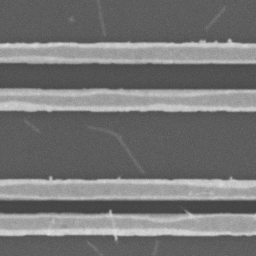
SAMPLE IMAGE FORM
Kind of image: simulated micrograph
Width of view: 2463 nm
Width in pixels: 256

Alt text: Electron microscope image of lines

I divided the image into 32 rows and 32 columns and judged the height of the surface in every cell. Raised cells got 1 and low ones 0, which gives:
00000000000000000000000000000000
00000000000000000000000000000000
00000000000000000000000000000000
00000000000000000000000000000000
00000000000000000000000000000000
00000000000000000000000000000000
11111111111111111111111111111111
11111111111111111111111111111111
00000000000000000000000000000000
00000000000000000000000000000000
00000000000000000000000000000000
11111111111111111111111111111111
11111111111111111111111111111111
00011111111111111111111111111111
00000000000000000000000000000000
00000000000000000000000000000000
00000000000000000000000000000000
00000000000000000000000000000000
00000000000000000000000000000000
00000000000000000000000000000000
00000000000000000000000000000000
00000000000000000000000000000000
00000000000000000000000000000000
11111111111111111111111111111111
11111111111111111111111111111111
00000000000000000000000000000000
00000000000000000000000000000000
11111111111111111111111111111111
11111111111111111111111111111111
00000000000000000000000000000000
00000000000000000000000000000000
00000000000000000000000000000000